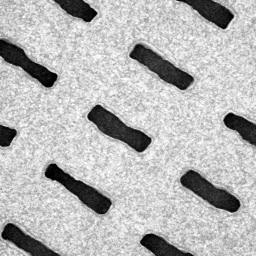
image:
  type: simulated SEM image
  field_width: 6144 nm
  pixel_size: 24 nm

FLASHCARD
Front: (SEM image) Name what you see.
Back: holes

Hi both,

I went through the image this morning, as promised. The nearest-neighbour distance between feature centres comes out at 1770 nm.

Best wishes